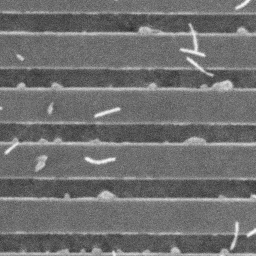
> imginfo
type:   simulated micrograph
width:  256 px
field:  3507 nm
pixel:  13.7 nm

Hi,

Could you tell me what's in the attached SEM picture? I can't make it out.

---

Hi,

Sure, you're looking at lines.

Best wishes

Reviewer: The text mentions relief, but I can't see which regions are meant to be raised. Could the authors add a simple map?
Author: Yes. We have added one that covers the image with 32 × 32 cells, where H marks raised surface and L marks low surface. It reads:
HHHHHHHHHHHHHHHHHHHHHHHHHHHHHHHH
HHHHHHHHHHHHHHHHHHHHHHHHHHHHHHHH
LLLLLLLLLLLLLLLLLLLLLLLLLLLLLLLL
LLLLLLLLLLLLLLLLLLLLLLLLLLLLLLLL
HHHHHHHHHHHHHHHHHHHHHHHHHHHHHHHH
HHHHHHHHHHHHHHHHHHHHHHHHHHHHHHHH
HHHHHHHHHHHHHHHHHHHHHHHHHHHHHHHH
HHHHHHHHHHHHHHHHHHHHHHHHHHHHHHHH
LLLLLLLLLLLLLLHHHHHLHHHHHHHHHHHH
LLLLLLLLLLLLLLLLLLLLLLLLLLLLLLLL
LLLLLLLLLLLLLLLLLLLLLLLLLLLHHLLL
HHHHHHHHHHHHHHHHHHHHHHHHHHHHHHHH
HHHHHHHHHHHHHHHHHHHHHHHHHHHHHHHH
HHHHHHHHHHHHHHHHHHHHHHHHHHHHHHHH
HHHHHHHHHHHHHHHHHHHHHHHHHHHHHHHH
LLLLLLLLLLLLLLLLLLLLLHHHLLLHHHHH
LLLLLLLLLLLLLLLLLLLLLLLLLLLLLLLL
LLLLLLLLLLLLLLLLLLLLLLLLHLLLLLLL
HHHHHHHHHHHHHHHHHHHHHHHHHHHHHHHH
HHHHHHHHHHHHHHHHHHHHHHHHHHHHHHHH
HHHHHHHHHHHHHHHHHHHHHHHHHHHHHHHH
HHHHHHHHHHHHHHHHHHHHHHHHHHHHHHHH
LLLLLLLLLLLLLLLLLLLLLLLLLLLLLLLL
LLLLLLLLLLLLLLLLLLLLLLLLLLLLLLLL
LLLLLLLLLLLLHHLLLLLLLLLLLLLLLLLL
HHHHHHHHHHHHHHHHHHHHHHHHHHHHHHHH
HHHHHHHHHHHHHHHHHHHHHHHHHHHHHHHH
HHHHHHHHHHHHHHHHHHHHHHHHHHHHHHHH
HHHHHHHHHHHHHHHHHHHHHHHHHHHHHHHH
LLLLLLLLLLLLLLLLLLLLLLLLLLLLLLLL
LLLLLLLLLLLLLLLLLLLLLLLLLLLLLLLL
LLLLLLLLHLLHHLHLLLLLLHLLLLLLLLLL